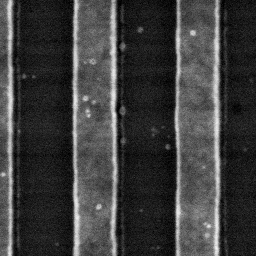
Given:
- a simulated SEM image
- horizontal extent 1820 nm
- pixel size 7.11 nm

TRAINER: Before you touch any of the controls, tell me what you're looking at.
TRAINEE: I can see lines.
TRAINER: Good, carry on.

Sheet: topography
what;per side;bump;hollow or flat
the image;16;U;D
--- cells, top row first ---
UDDDDUUDDDDUUUDD
UDDDDUUDDDDUUUDD
UDDDDUUDDDDUUUDD
UDDDDUUDDDDUUUDD
UDDDDUUDDDDUUUDD
UDDDDUUDDDDUUUDD
UDDDDUUDDDDUUUDD
UDDDDUUDDDDUUUDD
UDDDDUUDDDDUUUDD
UDDDDUUDDDDUUUDD
UDDDDUUDDDDUUUDD
UDDDDUUDDDDUUUDD
UDDDDUUDDDDUUUDD
UDDDDUUDDDDUUUDD
UDDDDUUDDDDUUUDD
UDDDDUUDDDDUUUDD